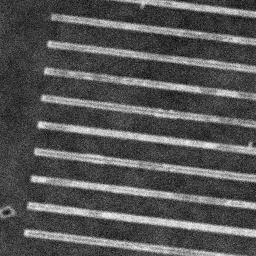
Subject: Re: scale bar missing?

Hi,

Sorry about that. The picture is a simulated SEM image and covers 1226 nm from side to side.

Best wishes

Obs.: parallel lines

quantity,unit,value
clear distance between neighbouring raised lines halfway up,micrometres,0.102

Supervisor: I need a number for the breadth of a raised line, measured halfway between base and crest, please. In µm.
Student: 0.0267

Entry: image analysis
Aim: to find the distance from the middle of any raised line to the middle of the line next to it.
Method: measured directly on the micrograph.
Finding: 130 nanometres